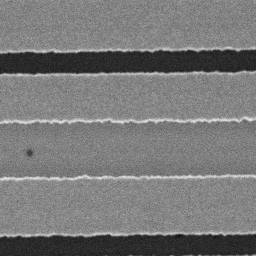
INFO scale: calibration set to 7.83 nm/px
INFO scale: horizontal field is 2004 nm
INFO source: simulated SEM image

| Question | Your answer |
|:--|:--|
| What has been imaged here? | lines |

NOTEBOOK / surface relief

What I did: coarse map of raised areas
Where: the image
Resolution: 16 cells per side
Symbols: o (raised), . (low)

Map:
oooooooooooooooo
oooooooooooooooo
oooooooooooooooo
................
...............o
oooooooooooooooo
oooooooooooooooo
ooooooooooooooo.
................
................
................
oooooooooooooooo
oooooooooooooooo
oooooooooooooooo
oooooooooooooooo
................